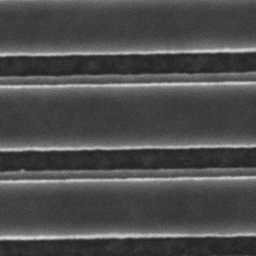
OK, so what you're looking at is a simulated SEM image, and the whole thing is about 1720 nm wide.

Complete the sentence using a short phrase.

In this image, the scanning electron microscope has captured lines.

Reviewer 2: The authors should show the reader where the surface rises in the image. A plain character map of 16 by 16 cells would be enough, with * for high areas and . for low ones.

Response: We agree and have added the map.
****************
****************
****************
................
................
****************
****************
****************
****************
................
................
****************
****************
****************
****************
................